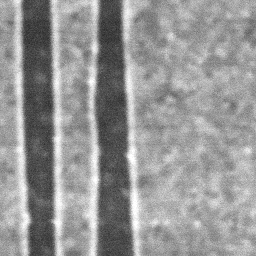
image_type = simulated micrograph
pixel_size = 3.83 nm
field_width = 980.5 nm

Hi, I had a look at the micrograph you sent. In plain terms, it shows one or a few lines or trenches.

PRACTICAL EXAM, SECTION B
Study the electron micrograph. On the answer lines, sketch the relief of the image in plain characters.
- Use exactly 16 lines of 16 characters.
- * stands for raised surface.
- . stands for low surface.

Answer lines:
*..***..********
*..***..********
*..***..********
*..***..********
*...**..********
*...**..********
*...**..********
*...**..********
*...**..********
*...**..********
*...**..********
*...**..********
*...**..********
**..**..********
**..**..********
**..**...*******